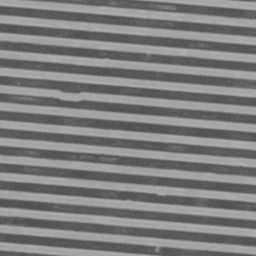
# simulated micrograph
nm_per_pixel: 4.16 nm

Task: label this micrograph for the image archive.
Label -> parallel lines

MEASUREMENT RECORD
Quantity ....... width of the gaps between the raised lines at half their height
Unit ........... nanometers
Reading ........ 40.4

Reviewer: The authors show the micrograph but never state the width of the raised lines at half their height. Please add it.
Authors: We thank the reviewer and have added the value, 7.72 pixels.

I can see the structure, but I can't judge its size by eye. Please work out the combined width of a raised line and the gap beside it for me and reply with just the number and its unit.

72.4 nm